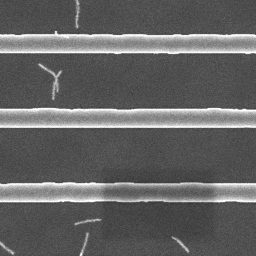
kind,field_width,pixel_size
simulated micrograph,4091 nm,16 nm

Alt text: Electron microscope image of lines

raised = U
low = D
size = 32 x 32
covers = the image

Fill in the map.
DDDDDDDDDDDDDDDDDDDDDDDDDDDDDDDD
DDDDDDDDDDDDDDDDDDDDDDDDDDDDDDDD
DDDDDDDDDDDDDDDDDDDDDDDDDDDDDDDD
DDDDDDDDDDDDDDDDDDDDDDDDDDDDDDDD
UUUUUUUUUUUUUUUUUUUUUUUUUUUUUUUU
UUUUUUUUUUUUUUUUUUUUUUUUUUUUUUUU
UUUUUUUUUUUUUUUUUUUUUUUUUUUUUUUU
DDDDDDDDDDDDDDDDDDDDDDDDDDDDDDDD
DDDDDDDDDDDDDDDDDDDDDDDDDDDDDDDD
DDDDDDDDDDDDDDDDDDDDDDDDDDDDDDDD
DDDDDDDDDDDDDDDDDDDDDDDDDDDDDDDD
DDDDDDDDDDDDDDDDDDDDDDDDDDDDDDDD
DDDDDDDDDDDDDDDDDDDDDDDDDDDDDDDD
DDDDDDDDDDDDDDDDDDDDDDDDDDDDDDDD
UUUUUUUUUUUUUUUUUUUUUUUUUUUUUUUU
UUUUUUUUUUUUUUUUUUUUUUUUUUUUUUUU
DDDDDDDDDDDDDDDDDDDDDDDDDDDDDDDD
DDDDDDDDDDDDDDDDDDDDDDDDDDDDDDDD
DDDDDDDDDDDDDDDDDDDDDDDDDDDDDDDD
DDDDDDDDDDDDDDDDDDDDDDDDDDDDDDDD
DDDDDDDDDDDDDDDDDDDDDDDDDDDDDDDD
DDDDDDDDDDDDDDDDDDDDDDDDDDDDDDDD
DDDDDDDDDDDDDDDDDDDDDDDDDDDDDDDD
UUUUUUUUUUUUUUUUUUUUUUUUUUUUUUUU
UUUUUUUUUUUUUUUUUUUUUUUUUUUUUUUU
DDDDDDDDDDDDDDDDDDDDDDDDDDDDDDDD
DDDDDDDDDDDDDDDDDDDDDDDDDDDDDDDD
DDDDDDDDDDDDDDDDDDDDDDDDDDDDDDDD
DDDDDDDDDDDDDDDDDDDDDDDDDDDDDDDD
DDDDDDDDDDDDDDDDDDDDDDDDDDDDDDDD
DDDDDDDDDDDDDDDDDDDDDDDDDDDDDDDD
DDDDDDDDDDDDDDDDDDDDDDDDDDDDDDDD